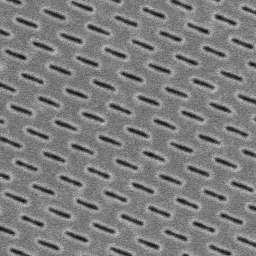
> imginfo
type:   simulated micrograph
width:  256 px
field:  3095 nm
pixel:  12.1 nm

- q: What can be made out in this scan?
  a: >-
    a regular array of holes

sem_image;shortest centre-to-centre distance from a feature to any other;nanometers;344